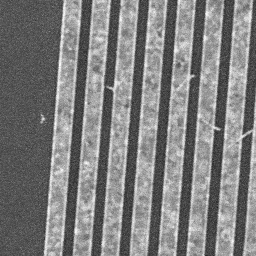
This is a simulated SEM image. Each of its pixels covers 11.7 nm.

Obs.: parallel lines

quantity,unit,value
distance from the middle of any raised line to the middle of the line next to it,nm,333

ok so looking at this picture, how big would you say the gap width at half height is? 136 nm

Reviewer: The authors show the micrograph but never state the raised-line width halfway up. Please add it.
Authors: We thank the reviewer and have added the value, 193 nm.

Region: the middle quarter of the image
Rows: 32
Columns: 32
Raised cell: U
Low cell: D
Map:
UUUDDDUUUUDDDUUUUDDDUUUUDDDUUUUD
UUUDDDUUUUDDDUUUUDDDUUUUDDDUUUUD
UUUDDDUUUUDDDUUUUDDDUUUUDDDUUUUD
UUUDDDUUUUDDDUUUUDDDUUUUDDDUUUUU
UUUDDDUUUUDDDUUUUDDDUUUUDDDUUUUD
UUUDDDUUUUDDDUUUUDDDUUUUDDDUUUUD
UUUDDDUUUUDDUUUUUDDDUUUUDDDUUUUD
UUUDDDUUUUDDDUUUUDDDUUUUDDDUUUUD
UUDDDDUUUDDDDUUUDDDDUUUUDDDUUUUD
UUDDDUUUUDDDUUUUDDDDUUUUDDDUUUUD
UUDDDUUUUDDDUUUUDDDDUUUUDDDUUUUD
UUDDDUUUUDDDUUUUDDDDUUUUDDDUUUUD
UUDDDUUUUDDDUUUUDDDDUUUDDDDUUUDD
UUDDDUUUUDDDUUUUDDDUUUUDDDUUUUDD
UUDDDUUUUDDDUUUUDDDUUUUDDDUUUUDD
UUDDDUUUUDDDUUUUDDDUUUUDDDUUUUDD
UUDDDUUUUDDDUUUUDDDUUUUDDDUUUUDD
UUDDDUUUUDDDUUUUDDDUUUUDDDUUUUDD
UUDDDUUUUDDDUUUUDDDUUUUDDDUUUUDD
UUDDDUUUUDDDUUUUDDDUUUUDDDUUUUDD
UUDDDUUUUDDDUUUUDDDUUUUDDDUUUUDD
UDDDDUUUDDDDUUUDDDDUUUUDDDUUUUDD
UDDDUUUUDDDUUUUDDDDUUUUDDDUUUUDD
UDDDUUUUDDDUUUUDDDDUUUUDDDUUUUDD
UDDDUUUUDDDUUUUDDDDUUUUDDDUUUUDD
UDDDUUUUDDDUUUUDDDDUUUDDDDUUUDDD
UDDDUUUUDDDUUUUDDDUUUUDDDUUUUDDD
UDDDUUUUDDDUUUUDDDUUUUDDDUUUUDDD
UDDDUUUUDDDUUUUDDDUUUUDDDUUUUDDD
UDDDUUUUDDDUUUUDDDUUUUDDDUUUUDDD
UDDDUUUUDDDUUUUDDDUUUUDDDUUUUDDD
UDDDUUUUDDDUUUUDDDUUUUDDDUUUUDDD